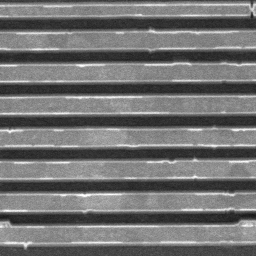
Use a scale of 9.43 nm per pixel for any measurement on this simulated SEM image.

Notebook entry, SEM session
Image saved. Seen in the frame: parallel lines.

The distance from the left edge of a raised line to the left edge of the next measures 302 nanometers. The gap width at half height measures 126 nanometres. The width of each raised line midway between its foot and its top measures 177 nm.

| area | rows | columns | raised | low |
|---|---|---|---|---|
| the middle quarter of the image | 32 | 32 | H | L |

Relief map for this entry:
HHHHHHHHHHHHHHHHHHHHHHHHHHHHHHHH
HHHHHHHHHHHHHHHHHHHHHHHHHHHHHHHH
HHHHHHHHHHHHHHHHHHHHHHHHHHHHHHHH
HHHHHHHHHHHHHHHHHHHHHHHHHHHHHHHH
HHHHHHHHHLLLLLLLLLLLLLLLLLLLLLLL
LLLLLLLLLLLLLLLLLLLLLLLLLLLLLLLL
LLLLLLLLLLLLLLLLLLLLLLLLLLLLLLLL
LLLLLLLLLLLLLLLLLLLLLLLLLLLLLLLL
HHHHHHHHHHHHHHHHHHHHHHHHHHHHHHHH
HHHHHHHHHHHHHHHHHHHHHHHHHHHHHHHH
HHHHHHHHHHHHHHHHHHHHHHHHHHHHHHHH
HHHHHHHHHHHHHHHHHHHHHHHHHHHHHHHH
HHHHHHHHHHHHHHLLLLLLLLLLLLLLLLLL
LLLLLLLLLLLLLLLLLLLLLLLLLLLLLLLL
LLLLLLLLLLLLLLLLLLLLLLLLLLLLLLLL
LLLLLLLLLLLLLLLLLLLLLLLLLLLLLLLL
HHHHHHHHHHHHHHHHHHHHHHHHHHHHHHHH
HHHHHHHHHHHHHHHHHHHHHHHHHHHHHHHH
HHHHHHHHHHHHHHHHHHHHHHHHHHHHHHHH
HHHHHHHHHHHHHHHHHHHHHHHHHHHHHHHH
HHHHHHHHHHHHHHHHHHHHHHHHHHHHHHHH
LLLLLLLLLLLLLLLLLLLLLLLLLLLLLLLL
LLLLLLLLLLLLLLLLLLLLLLLLLLLLLLLL
LLLLLLLLLLLLLLLLLLLLLLLLLLLLLLLL
HHHHHHHHHHHHHHHHHHHHHHHHHHHHHHHH
HHHHHHHHHHHHHHHHHHHHHHHHHHHHHHHH
HHHHHHHHHHHHHHHHHHHHHHHHHHHHHHHH
HHHHHHHHHHHHHHHHHHHHHHHHHHHHHHHH
HHHHHHHHHHHHHHHHHHHHHHHHHHHHHHHH
LLLLLLLLLLLLLLLLLLLLLLLLLLLLLLLL
LLLLLLLLLLLLLLLLLLLLLLLLLLLLLLLL
LLLLLLLLLLLLLLLLLLLLLLLLLLLLLLLL